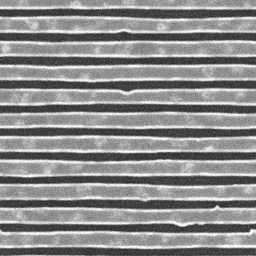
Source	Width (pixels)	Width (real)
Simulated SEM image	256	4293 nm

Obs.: parallel lines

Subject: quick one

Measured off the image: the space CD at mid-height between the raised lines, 159 nanometres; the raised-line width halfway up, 0.254 microns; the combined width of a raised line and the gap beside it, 400 nanometers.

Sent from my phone